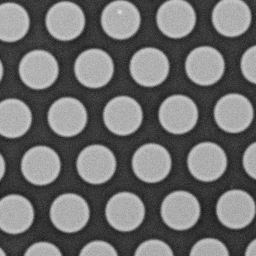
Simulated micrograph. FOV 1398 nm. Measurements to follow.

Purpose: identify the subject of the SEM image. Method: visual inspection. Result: an array of small figures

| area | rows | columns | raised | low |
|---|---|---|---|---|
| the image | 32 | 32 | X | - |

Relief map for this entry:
XX-----XX-----XX----XXXX---XXXX-
XXX---XXXX---XXXX---XXXX---XXXX-
XXXX--XXXXX--XXXX---XXXX---XXXX-
XXXX--XXXX---XXXX---XXXX---XXXX-
XXX----XXX----XX-----XX-----XX--
--------------------------------
----XX----XXX----XXX----XXX----X
---XXXX---XXXX--XXXXX--XXXXX--XX
--XXXXX--XXXXX--XXXXX--XXXXX--XX
---XXXX---XXXX--XXXXX---XXXX---X
---XXX----XXX----XXX-----X------
--------------------------------
-X-----XXX----XXX----XXX---XXXX-
XXXX--XXXXX--XXXXX--XXXXX--XXXXX
XXXX--XXXXX--XXXXX--XXXXX--XXXXX
XXXX--XXXXX--XXXXX--XXXX---XXXX-
XXX----XXX----XXX----XX------X--
--------------------------------
----XX-----XX----XXX----XXXX---X
---XXXX---XXXX---XXXX---XXXX--XX
X--XXXXX--XXXX---XXXX--XXXXX--XX
X--XXXX---XXXX---XXXX---XXXX---X
---XXXX----XX-----XX-----XX-----
--------------------------------
-XX-----XX----XXX----XXX----XXX-
XXXX---XXXX--XXXXX--XXXXX--XXXXX
XXXX--XXXXX--XXXXX--XXXXX--XXXXX
XXXX--XXXXX--XXXXX--XXXXX--XXXX-
XXX----XXX----XXX-----XX-----X--
--------------------------------
----XX-----XXX----XXX---XXXX---X
---XXXX---XXXXX--XXXXX--XXXX---X